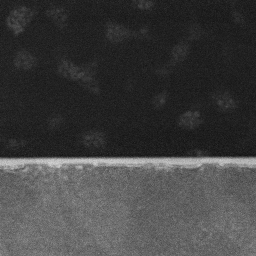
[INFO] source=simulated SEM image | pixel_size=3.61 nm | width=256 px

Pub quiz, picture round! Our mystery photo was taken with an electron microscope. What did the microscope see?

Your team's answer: one or a few lines or trenches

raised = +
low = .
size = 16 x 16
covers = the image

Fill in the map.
................
................
................
................
................
................
................
................
................
................
++++++++++++++++
++++++++++++++++
++++++++++++++++
++++++++++++++++
++++++++++++++++
++++++++++++++++